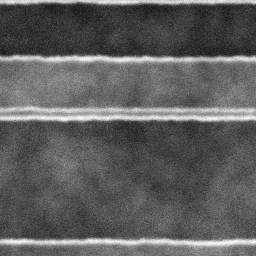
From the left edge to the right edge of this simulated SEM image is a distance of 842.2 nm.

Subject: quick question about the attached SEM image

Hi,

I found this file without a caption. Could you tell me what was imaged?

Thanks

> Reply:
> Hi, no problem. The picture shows lines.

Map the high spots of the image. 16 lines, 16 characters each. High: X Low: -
----------------
----------------
----------------
----------------
XXXXXXXXXXXXXXXX
XXXXXXXXXXXXXXXX
XXXXXXXXXXXXXXXX
----------------
----------------
----------------
----------------
----------------
----------------
----------------
----------------
XXXXXXXXXXXXXXXX